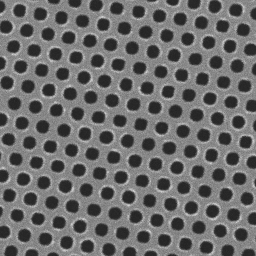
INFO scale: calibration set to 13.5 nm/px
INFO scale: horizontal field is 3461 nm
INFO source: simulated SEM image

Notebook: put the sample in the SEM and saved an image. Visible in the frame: a regular array of holes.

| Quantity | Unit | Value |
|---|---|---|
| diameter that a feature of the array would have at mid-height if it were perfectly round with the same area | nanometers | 186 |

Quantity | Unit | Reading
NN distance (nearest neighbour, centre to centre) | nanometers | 284